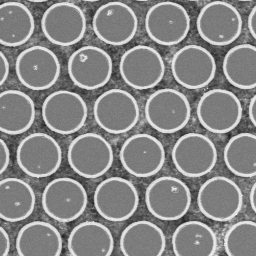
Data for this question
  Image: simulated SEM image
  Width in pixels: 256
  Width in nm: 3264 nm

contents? a regular array of raised bodies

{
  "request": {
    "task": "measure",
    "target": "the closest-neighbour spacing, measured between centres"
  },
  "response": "644 nm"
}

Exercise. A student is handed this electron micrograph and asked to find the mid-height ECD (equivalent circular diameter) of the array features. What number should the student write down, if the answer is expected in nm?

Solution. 531